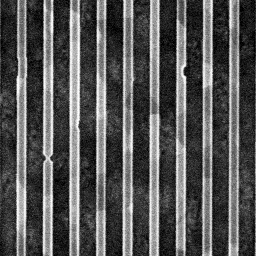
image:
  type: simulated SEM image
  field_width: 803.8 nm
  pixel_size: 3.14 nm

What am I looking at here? parallel lines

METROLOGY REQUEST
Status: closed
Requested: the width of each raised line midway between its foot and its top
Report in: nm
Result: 24.8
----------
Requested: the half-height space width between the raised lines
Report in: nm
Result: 60.1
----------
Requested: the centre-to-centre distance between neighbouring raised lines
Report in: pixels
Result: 26.6